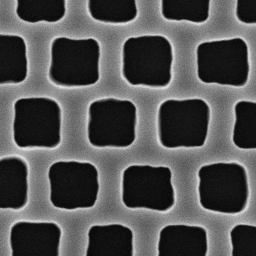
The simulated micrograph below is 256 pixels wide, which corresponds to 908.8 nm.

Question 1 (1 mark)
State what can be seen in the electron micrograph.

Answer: a regular array of holes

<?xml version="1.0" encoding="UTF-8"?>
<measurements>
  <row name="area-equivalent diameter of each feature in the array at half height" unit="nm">186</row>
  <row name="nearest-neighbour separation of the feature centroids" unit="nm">256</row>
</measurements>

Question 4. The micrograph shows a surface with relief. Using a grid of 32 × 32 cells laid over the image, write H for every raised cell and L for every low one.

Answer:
HHLLLLLLHHHLLLLLLHHHLLLLLLHHHHLL
HHLLLLLLHHHLLLLLLHHHLLLLLLHHHLLL
HHHLLLLHHHHHLLLLHHHHHLLLLLHHHHLL
HHHHHHHHHHHHHHHHHHHHHHHHHHHHHHHH
LLHHHHHHHHHHHHHHHHLLHHHHHHHHHHHH
LLLHHHHLLLLLHHHHLLLLLHHHHLLLLLLH
LLLHHHLLLLLLHHHLLLLLLHHHHLLLLLLH
LLLHHHLLLLLLHHHLLLLLLHHHHLLLLLLH
LLLHHHLLLLLLHHHLLLLLLHHHHLLLLLLH
LLLHHHLLLLLLHHHHLLLLLHHHHLLLLLLH
HHHHHHHLLLLLHHHHLLLLLHHHHHHLLLLH
HHHHHHHHHHHHHHHHHHHHHHHHHHHHHHHH
HHLLLLLHHHHHHLLLHHHHHLHLLHHHHHHH
HHLLLLLHHHHLLLLLLHHHLLLLLLHHHLLL
HHLLLLLLHHHLLLLLLHHHLLLLLLHHHHLL
HHLLLLLLHHHLLLLLLHHHLLLLLLHHHLLL
HHLLLLLLHHHLLLLLLHHHLLLLLLHHHLLL
HHLLLLLHHHHLLLLLLHHHLLLLLLHHHLLL
HHHHHHHHHHHHHHHHHHHHHHHHHHHHHHLL
HHHHHHHHHHHHHHHHHHHHHHHHHHHHHHHH
LLLHHHHLLLLHHHHHHHHHHHHHHHHLLLHH
LLLHHHLLLLLLHHHHLLLLLHHHHLLLLLLH
LLLHHHLLLLLLHHHLLLLLLHHHHLLLLLLH
LLLHHHLLLLLLHHHLLLLLLLHHHLLLLLLH
LLLHHHLLLLLLHHHLLLLLLLHHHLLLLLLH
LLLHHHHLLLLLHHHHLLLLLLHHHLLLLLLH
HHHHHHHHHHHHHHHHHHHHHHHHHHHHLLHH
HHHHHHHHHHHHHHHHHHHHHHHHHHHHHHHH
HHLLLLLHHHHLLLLLHHHHLLLLLHHHHLLL
HLLLLLLHHHHLLLLLLHHHLLLLLLHHHLLL
HLLLLLLHHHHLLLLLLHHHLLLLLLHHHLLL
HLLLLLLHHHHLLLLLLHHHLLLLLLHHHLLL